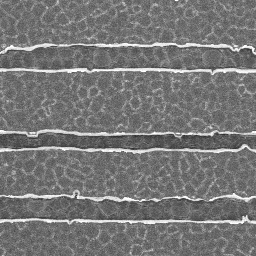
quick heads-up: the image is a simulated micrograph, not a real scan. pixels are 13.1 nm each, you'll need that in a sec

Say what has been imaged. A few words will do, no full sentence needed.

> one or a few lines or trenches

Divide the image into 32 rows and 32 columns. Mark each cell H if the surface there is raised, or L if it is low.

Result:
HHHHHHHHHHHHHHHHHHHHHHHHHHHHHHHH
HHHHHHHHHHHHHHHHHHHHHHHHHHHHHHHH
HHHHHHHHHHHHHHHHHHHHHHHHHHHHHHHH
HHHHHHHHHHHHHHHHHHHHHHHHHHHHHHHH
HHHHHHHHHHHHHHHHHHHHHHHHHHHHHHHH
HHHHHHHHHHHHHHHHHHHHHHHHHHHHHHHH
HLLLLLLLLLLLLLLLLLLLLLLLLLLLLLLL
LLLLLLLLLLLLLLLLLLLLLLLLLLLLLLLL
LLLLLLLLLLLLLLLLLLLLLLLLLLLLLLLL
HHHHHHHHHHHHHHHHHHHHHHHHHHHHHHHH
HHHHHHHHHHHHHHHHHHHHHHHHHHHHHHHH
HHHHHHHHHHHHHHHHHHHHHHHHHHHHHHHH
HHHHHHHHHHHHHHHHHHHHHHHHHHHHHHHH
HHHHHHHHHHHHHHHHHHHHHHHHHHHHHHHH
HHHHHHHHHHHHHHHHHHHHHHHHHHHHHHHH
HHHHHHHHHHHHHHHHHHHHHHHHHHHHHHHH
HHHHHLLLHHHHHHHHHHHHHHHHHHHHHHHH
LLLLLLLLLLLLLLLLLLLLLLLLLLLLLLLL
LLLLLHHLLLLLLLLLLLLLLLLLLLLLLLHL
HHHHHHHHHHHHHHHHHHHHHHHHHHHHHHHH
HHHHHHHHHHHHHHHHHHHHHHHHHHHHHHHH
HHHHHHHHHHHHHHHHHHHHHHHHHHHHHHHH
HHHHHHHHHHHHHHHHHHHHHHHHHHHHHHHH
HHHHHHHHHHHHHHHHHHHHHHHHHHHHHHHH
HHHLHHHLLHHHHHHHHHHHHHHHHHHHHHHH
LLLLLLLLLLLLLLLLLLLLLLLLLLLLLLLL
LLLLLLLLLLLLLLLLLLLLLLLLLLLLLLLL
LLLHHHLLLLLLLLLLLLLLLLLLLLLLLLHL
HHHHHHHHHHHHHHHHHHHHHHHHHHHHHHHH
HHHHHHHHHHHHHHHHHHHHHHHHHHHHHHHH
HHHHHHHHHHHHHHHHHHHHHHHHHHHHHHHH
HHHHHHHHHHHHHHHHHHHHHHHHHHHHHHHH